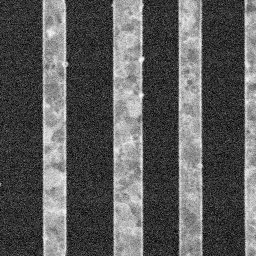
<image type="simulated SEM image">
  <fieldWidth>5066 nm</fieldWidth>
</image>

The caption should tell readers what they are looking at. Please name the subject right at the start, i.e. one or a few lines or trenches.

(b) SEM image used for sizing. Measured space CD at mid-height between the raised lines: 0.881 micrometres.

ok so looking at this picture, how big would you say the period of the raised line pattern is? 67.7 px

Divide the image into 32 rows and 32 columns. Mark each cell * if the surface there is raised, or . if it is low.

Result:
......**......****.....**......*
......**......****.....**......*
......**......****.....**......*
......**......****.....**......*
......**......****.....**......*
......**......****.....**......*
......**......****.....**......*
......**......****.....**......*
......**......****.....**......*
......**......****.....**......*
......**......****.....**......*
......**......****.....**......*
......**......****.....**......*
......**......****.....**......*
......**......****.....**......*
......**......****.....**......*
......**......****.....**......*
......**......****.....**......*
......**......****.....**......*
......**......****.....**......*
......**......****.....**......*
......**......*.**.....**......*
......**.......***.....**......*
......**......****.....**......*
.....***......****.....**......*
......**......****.....**......*
......**......****.....**......*
......**......****.....**......*
......**......****.....**......*
.....***......****.....**......*
......**......****.....**......*
......**......****.....**......*